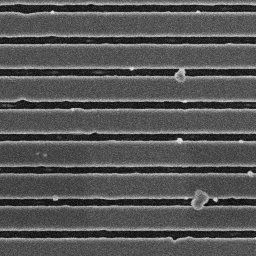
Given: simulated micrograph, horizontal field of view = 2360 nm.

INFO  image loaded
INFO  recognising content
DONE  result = parallel lines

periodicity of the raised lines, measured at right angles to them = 298 nm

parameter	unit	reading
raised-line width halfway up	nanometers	228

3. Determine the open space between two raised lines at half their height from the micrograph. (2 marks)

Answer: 66.8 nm